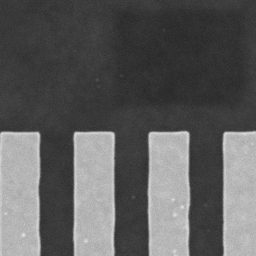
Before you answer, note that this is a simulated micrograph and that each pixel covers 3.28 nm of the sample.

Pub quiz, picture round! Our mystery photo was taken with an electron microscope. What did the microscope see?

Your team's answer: wiring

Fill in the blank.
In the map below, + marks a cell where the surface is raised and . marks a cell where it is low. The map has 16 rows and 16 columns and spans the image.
................
................
................
................
................
................
................
................
++...++..+++..++
++...++..+++..++
++...++..+++..++
++...++..+++..++
++...++..+++..++
++...++..+++..++
++...++..+++..++
++...++..+++..++